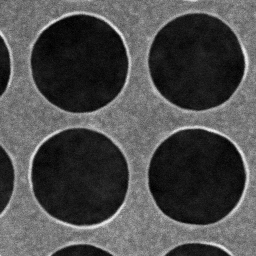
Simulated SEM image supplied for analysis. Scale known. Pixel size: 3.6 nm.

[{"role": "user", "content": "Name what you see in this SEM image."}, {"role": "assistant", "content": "holes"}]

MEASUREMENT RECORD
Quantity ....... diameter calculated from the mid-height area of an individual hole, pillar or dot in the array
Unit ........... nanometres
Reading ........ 352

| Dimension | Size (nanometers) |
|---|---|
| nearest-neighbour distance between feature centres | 411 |